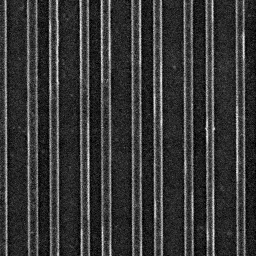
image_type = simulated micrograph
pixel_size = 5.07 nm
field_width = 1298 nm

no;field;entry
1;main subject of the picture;parallel lines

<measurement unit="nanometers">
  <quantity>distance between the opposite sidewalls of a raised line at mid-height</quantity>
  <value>45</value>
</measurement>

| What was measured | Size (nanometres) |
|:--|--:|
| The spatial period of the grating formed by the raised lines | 132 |